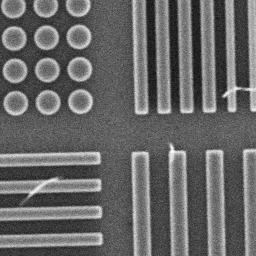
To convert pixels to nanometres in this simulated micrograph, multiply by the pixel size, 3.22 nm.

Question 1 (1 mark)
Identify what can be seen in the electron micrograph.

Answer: groups of lines, slits or small figures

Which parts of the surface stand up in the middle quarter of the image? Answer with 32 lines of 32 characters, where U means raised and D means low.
DUUUUUUDDDDDDDDDDDUUUDDUUUDDDUUU
DUUUUUUDDDDDDDDDDDUUUDDUUUDDDUUU
DUUUUUUDDDDDDDDDDDUUUDDUUUDDDUUU
DDUUUUDDDDDDDDDDDDUUUDDUUUDDDUUU
DDDDDDDDDDDDDDDDDDUUUDDDUUDDDUUU
DDDDDDDDDDDDDDDDDDUUUDDDUUDDDUUU
DDDUUDDDDDDDDDDDDDUUUDDDUUDDDUUU
DDUUUUDDDDDDDDDDDDUUUDDDUUDDDUUU
DUUUUUUDDDDDDDDDDDUUUDDDUUDDDUUU
DUUUUUUDDDDDDDDDDDUUUDDDUUDDDUUU
DUUUUUUDDDDDDDDDDDUUUDDDUUDDDUUU
DDUUUUDDDDDDDDDDDDUUUDDDUUDDDUUU
DDDDDDDDDDDDDDDDDDDDDDDDDDDDDDDD
DDDDDDDDDDDDDDDDDDDDDDDDDDDDDDDD
DDDDDDDDDDDDDDDDDDDDDDDDDDDDDDDD
DDDDDDDDDDDDDDDDDDDDDDDDDDDDDDDD
DDDDDDDDDDDDDDDDDDDDDDDDDDDDDDDD
DDDDDDDDDDDDDDDDDDDDDDDDDDDDDDDD
DDDDDDDDDDDDDDDDDDDDDDDDDDDDDDDD
DDDDDDDDDDDDDDDDDDDDDDDDDDDDDDDD
DDDDDDDDDDDDDDDDDDDDDDDDDDDDDDDD
DDDDDDDDDDDDDDDDDDDDDDDDDDDDDDDD
UUUUUUUUUDDDDDDDDUUUUDDDDDUUUUDD
UUUUUUUUUDDDDDDDDUUUUDDDDDUUUUDD
UUUUUUUUUDDDDDDDDUUUUDDDDDUUUUDD
DDDDDDDDDDDDDDDDDUUUUDDDDDUUUUDD
DDDDDDDDDDDDDDDDDUUUUDDDDDUUUUDD
DDDDDDDDDDDDDDDDDUUUUDDDDDUUUUDD
DDDDDDDDDDDDDDDDDUUUUDDDDDUUUUDD
UUUUUUUUUDDDDDDDDUUUUDDDDDUUUUDD
UUUUUUUUUDDDDDDDDUUUUDDDDDUUUUUD
UUUUUUUUUDDDDDDDDUUUUDDDDDDUUUUD